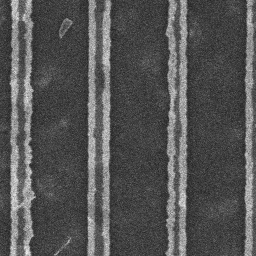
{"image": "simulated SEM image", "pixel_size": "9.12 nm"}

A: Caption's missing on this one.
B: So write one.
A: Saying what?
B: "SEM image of one or a few lines or trenches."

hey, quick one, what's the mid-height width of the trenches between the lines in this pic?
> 571 nanometres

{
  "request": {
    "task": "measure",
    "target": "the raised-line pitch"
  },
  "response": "711 nm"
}